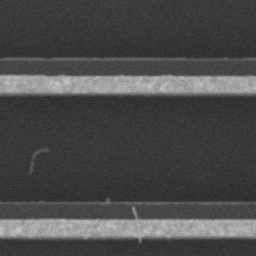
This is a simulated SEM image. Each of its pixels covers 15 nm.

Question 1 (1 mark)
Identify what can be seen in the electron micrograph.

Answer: lines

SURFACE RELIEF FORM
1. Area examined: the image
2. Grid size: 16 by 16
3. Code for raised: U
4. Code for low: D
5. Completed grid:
DDDDDDDDDDDDDDDD
DDDDDDDDDDDDDDDD
DDDDDDDDDDDDDDDD
DDDDDDDDDDDDDDDD
UUUUUUUUUUUUUUUU
UUUUUUUUUUUUUUUU
DDDDDDDDDDDDDDDD
DDDDDDDDDDDDDDDD
DDDDDDDDDDDDDDDD
DDDDDDDDDDDDDDDD
DDDDDDDDDDDDDDDD
DDDDDDDDDDDDDDDD
DDDDDDDDDDDDDDDD
UUUUUUUUUUUUUUUU
UUUUUUUUUUUUUUUU
DDDDDDDDDDDDDDDD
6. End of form